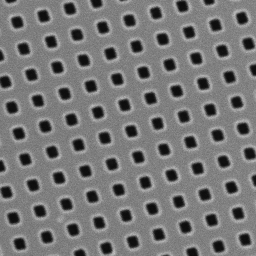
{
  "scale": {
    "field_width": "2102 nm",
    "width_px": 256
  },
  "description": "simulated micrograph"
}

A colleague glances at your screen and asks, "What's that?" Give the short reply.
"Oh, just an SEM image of a regular array of holes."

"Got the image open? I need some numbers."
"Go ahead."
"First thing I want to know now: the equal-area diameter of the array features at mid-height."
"106 nm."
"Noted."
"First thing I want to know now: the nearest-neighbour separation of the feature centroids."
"218 nm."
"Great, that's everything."